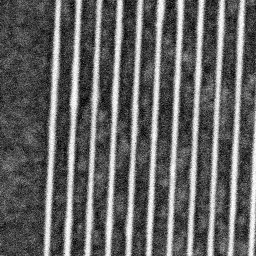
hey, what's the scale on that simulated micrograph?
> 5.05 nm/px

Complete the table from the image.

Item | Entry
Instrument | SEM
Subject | parallel lines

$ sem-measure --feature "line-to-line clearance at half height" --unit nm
82.5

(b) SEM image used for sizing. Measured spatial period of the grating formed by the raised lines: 0.103 micrometres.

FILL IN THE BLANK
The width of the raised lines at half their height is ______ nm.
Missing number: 18.3